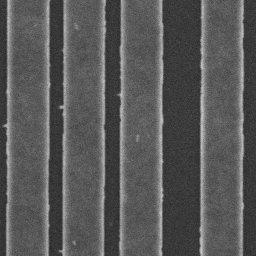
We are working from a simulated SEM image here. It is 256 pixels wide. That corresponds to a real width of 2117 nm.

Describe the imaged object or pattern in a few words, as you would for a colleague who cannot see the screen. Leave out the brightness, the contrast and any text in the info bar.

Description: lines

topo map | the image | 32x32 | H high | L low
LHHHHHLLHHHHHLLHHHHHLLLLLHHHHHLL
LHHHHHLLHHHHHLLHHHHHLLLLLHHHHHLL
LHHHHHLLHHHHHLLHHHHHLLLLLHHHHHLL
LHHHHHLLHHHHHLLHHHHHLLLLLHHHHHLL
LHHHHHLLHHHHHLLHHHHHLLLLLHHHHHLL
LHHHHHLLHHHHHLLHHHHHLLLLLHHHHHLL
LHHHHHLLHHHHHLLHHHHHLLLLLHHHHHLL
LHHHHHLLHHHHHLLHHHHHLLLLLHHHHHLL
LHHHHHLLHHHHHLLHHHHHLLLLLHHHHHLL
LHHHHHLLHHHHHLLHHHHHLLLLLHHHHHLL
LHHHHHLLHHHHHLLHHHHHLLLLLHHHHHLL
LHHHHHLLHHHHHLLHHHHHLLLLLHHHHHLL
LHHHHHLLHHHHHLLHHHHHLLLLLHHHHHLL
LHHHHHLLHHHHHLLHHHHHLLLLLHHHHHLL
LHHHHHLLHHHHHLLHHHHHLLLLLHHHHHLL
LHHHHHLLHHHHHLLHHHHHLLLLLHHHHHLL
LHHHHHLLHHHHHLLHHHHHLLLLLHHHHHLL
LHHHHHLLHHHHHLLHHHHHLLLLLHHHHHLL
LHHHHHLLHHHHHLLHHHHHLLLLLHHHHHLL
LHHHHHLLHHHHHLLHHHHHLLLLLHHHHHLL
LHHHHHLLHHHHHLLHHHHHLLLLLHHHHHLL
LHHHHHLLHHHHHLLHHHHHLLLLLHHHHHLL
LHHHHHLLHHHHHLLHHHHHLLLLLHHHHHLL
LHHHHHLLHHHHHLLHHHHHLLLLLHHHHHLL
LHHHHHLLHHHHHLLHHHHHLLLLLHHHHHLL
LHHHHHLLHHHHHLLHHHHHLLLLLHHHHHLL
LHHHHHLLHHHHHLLHHHHHLLLLLHHHHHLL
LHHHHHLLHHHHHLLHHHHHLLLLLHHHHHLL
LHHHHHLLHHHHHLLHHHHHLLLLLHHHHHLL
LHHHHHLLHHHHHLLHHHHHLLLLLHHHHHLL
LHHHHHLLHHHHHLLHHHHHLLLLLHHHHHLL
LHHHHHLLHHHHHLLHHHHHLLLLLHHHHHLL